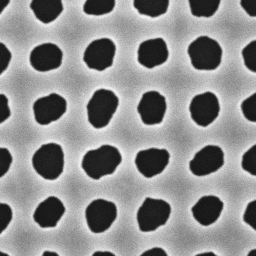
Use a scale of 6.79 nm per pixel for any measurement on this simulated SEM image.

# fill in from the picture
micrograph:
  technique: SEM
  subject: a regular array of holes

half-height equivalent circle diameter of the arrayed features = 32.5 pixels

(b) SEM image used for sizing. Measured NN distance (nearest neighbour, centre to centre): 348 nm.